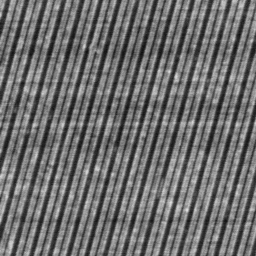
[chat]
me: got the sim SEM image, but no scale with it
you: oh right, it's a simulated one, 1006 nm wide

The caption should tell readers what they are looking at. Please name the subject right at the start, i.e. parallel lines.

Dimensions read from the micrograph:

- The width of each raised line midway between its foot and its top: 17.5 nanometres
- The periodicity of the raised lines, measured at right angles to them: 34.9 nm